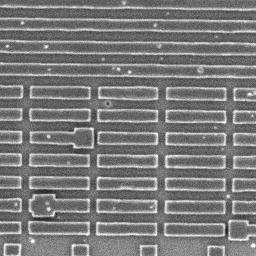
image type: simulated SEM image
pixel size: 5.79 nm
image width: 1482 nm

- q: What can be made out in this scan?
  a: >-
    wiring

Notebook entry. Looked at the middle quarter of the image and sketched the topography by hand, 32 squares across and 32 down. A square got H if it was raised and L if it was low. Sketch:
HHHHHHHHHHHHHHHHHHHHHHHHHHHHHHHH
HHHHHHHHHHHHHHHHHHHHHHHHHHHHHHHH
HHHHHHHHHHHHHHHHHHHHHHHHHHHHHHHH
LLLLLLLLLLLLLLLLLLLLLLLLLLLLLLLL
LLLLLLLLLLLLLLLLLLLLLLLLLLLLLLLL
LLLLLLLLLLLLLLLLLLLLLLLLLLLLLLLL
HHHHHHLLLHHHHHHHHHHHHHHLLLHHHHHH
HHHHHHLLLHHHHHHHHHHHHHHLLLHHHHHH
HHHHHHLLLLLLHHHHHHHHHHHLLLHHHHHH
LLLLLLLLLLLLLLLLLLLLLLLLLLLLLLLL
LLLLLLLLLLLLLLLLLLLLLLLLLLLLLLLL
HHHHHHLLLHHHHHHHHHHHHHLLLLLLLLLL
HHHHHHLLLHHHHHHHHHHHHHHLLLHHHHHH
HHHHHHLLLHHHHHHHHHHHHHHLLLHHHHHH
LLLLLLLLLLLLLLLLLLLLLLLLLLLLLLLL
LLLLLLLLLLLLLLLLLLLLLLLLLLLLLLLL
LLLHHHHLLLLLLLLLLLLLLLLLLLLLLLLL
HHHHHHHLLHHHHHHHHHHHHHHLLLHHHHHH
HHHHHHHLLHHHHHHHHHHHHHHLLLHHHHHH
HHHHHHHLLHHHHHHHHHHHHHHLLHHHHHHH
LLHHHHHLLLLLLLLLLLLLLLLLLLLLLLLL
LLLLLLLLLLLLLLLLLLLLLLLLLLLLLLLL
LLLLLLLLLLLLLLLLLLLLLLLLLLLLLLLL
HHHHHHLLLHHHHHHHHHHHHHHLLHHHHHHH
HHHHHHLLLHHHHHHHHHHHHHHLLHHHHHHH
HHHHHHLLLHHHHHHHHHHHHHHLLHHHHHHH
LLLLLLLLLLLLLLLLLLLLLLLLLLLLLLLL
LLLLLLLLLLLLLLLLLLLLLLLLLLLLLLLL
HHHHHHLLLHLLLLLLLLLLLLLLLLLLLLLL
HHHHHHLLHHHHHHHHHHHHHHHLLHHHHHHH
HHHHHHLLHHHHHHHHHHHHHHHLLHHHHHHH
LLLLLLLLLLLLLLLLLLLLLLLLLLLLLLHH